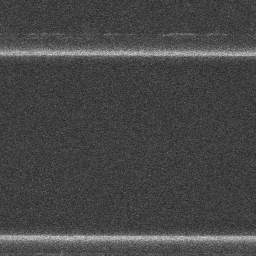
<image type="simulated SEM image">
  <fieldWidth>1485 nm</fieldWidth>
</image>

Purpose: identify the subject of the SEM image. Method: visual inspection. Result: one or a few lines or trenches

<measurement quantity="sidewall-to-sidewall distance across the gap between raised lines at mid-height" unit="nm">1070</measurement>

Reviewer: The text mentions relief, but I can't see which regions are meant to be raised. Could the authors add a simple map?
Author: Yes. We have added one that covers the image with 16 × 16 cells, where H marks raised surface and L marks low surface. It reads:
HHHHHHHHHHHHHHHH
HHHHHHHHHHHHHHHH
HHHHHHHHHHHHHHHH
LLLLLLLLLLLLLLLL
LLLLLLLLLLLLLLLL
LLLLLLLLLLLLLLLL
LLLLLLLLLLLLLLLL
LLLLLLLLLLLLLLLL
LLLLLLLLLLLLLLLL
LLLLLLLLLLLLLLLL
LLLLLLLLLLLLLLLL
LLLLLLLLLLLLLLLL
LLLLLLLLLLLLLLLL
LLLLLLLLLLLLLLLL
LLLLLLLLLLLLLLLL
HHHHHHHHHHHHHHHH